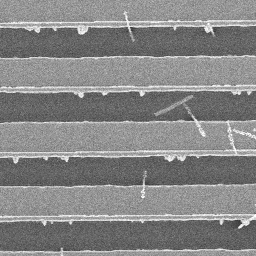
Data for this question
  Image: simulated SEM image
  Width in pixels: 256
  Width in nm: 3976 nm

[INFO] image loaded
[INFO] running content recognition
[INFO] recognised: lines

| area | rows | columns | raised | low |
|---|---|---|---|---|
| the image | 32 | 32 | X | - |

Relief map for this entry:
XXXXXXXXXXXXXXXXXXXXXXXXXXXXXXXX
XXXXXXXXXXXXXXXXXXXXXXXXXXXXXXXX
XXXXXXXXXXXXXXXXXXXXXXXXXXXXXXXX
---XX-X--XX--------------XX-----
--------------------------------
--------------------------------
--------------------------------
XXXXXXXXXXXXXXXXXXXXXXXXXXXXXXXX
XXXXXXXXXXXXXXXXXXXXXXXXXXXXXXXX
XXXXXXXXXXXXXXXXXXXXXXXXXXXXXXXX
XXXXXXXXXXXXXXXXXXXXXXXXXXXXXXXX
-X-------XX-XX---X-----------X--
--------------------------------
--------------------------------
--------------------------------
XXXXXXXXXXXXXXXXXXXXXXXXXXXXXXXX
XXXXXXXXXXXXXXXXXXXXXXXXXXXXXXXX
XXXXXXXXXXXXXXXXXXXXXXXXXXXXXXXX
XXXXXXXXXXXXXXXXXXXXXXXXXXXXXXXX
XXXXXXXXXXXXXXXXXXX-XXXXX-------
--------------------------------
--------------------------------
--------------------------------
XXXXXXXXXXXXXXXXXXXXXXXXXXXXXXXX
XXXXXXXXXXXXXXXXXXXXXXXXXXXXXXXX
XXXXXXXXXXXXXXXXXXXXXXXXXXXXXXXX
XXXXXXXXXXXXXXXXXXXXXXXXXXXXXXXX
XXXXXXXXXXXXXXXXXXXX-XX----X--XX
--------------------------------
--------------------------------
--------------------------------
XXXXXX-XXXXXXXXXXXXXXXXXXXXXXXXX